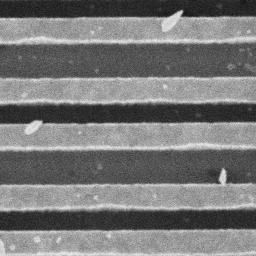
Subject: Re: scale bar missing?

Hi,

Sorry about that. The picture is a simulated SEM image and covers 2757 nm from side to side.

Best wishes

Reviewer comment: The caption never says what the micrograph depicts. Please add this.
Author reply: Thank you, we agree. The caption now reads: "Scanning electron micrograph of lines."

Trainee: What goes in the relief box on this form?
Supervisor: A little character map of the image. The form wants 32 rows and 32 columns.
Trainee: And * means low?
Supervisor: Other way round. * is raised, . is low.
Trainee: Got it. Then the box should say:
................................
................................
********************************
********************************
********************************
................................
................................
................................
................................
................................
********************************
********************************
********************************
................................
................................
...*****************************
********************************
********************************
************************...*****
................................
................................
................................
................................
********************************
********************************
********************************
................................
................................
................................
********************************
********************************
********************************